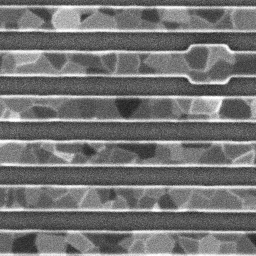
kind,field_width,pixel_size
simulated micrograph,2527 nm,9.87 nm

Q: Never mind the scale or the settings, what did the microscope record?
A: wiring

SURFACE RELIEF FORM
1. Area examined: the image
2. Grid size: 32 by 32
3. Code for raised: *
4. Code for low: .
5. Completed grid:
................................
********************************
********************************
********************************
................................
................................
**********...***.......*******..
********************************
********************************
.......................*******..
................................
................................
********************************
********************************
********************************
................................
................................
................................
********************************
********************************
********************************
................................
................................
********************************
********************************
********************************
................................
................................
................................
********************************
********************************
********************************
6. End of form